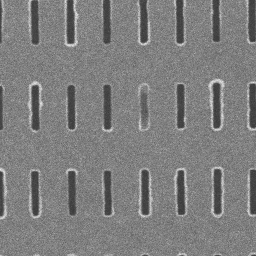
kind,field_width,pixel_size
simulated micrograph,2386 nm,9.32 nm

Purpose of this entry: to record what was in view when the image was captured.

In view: a regular array of holes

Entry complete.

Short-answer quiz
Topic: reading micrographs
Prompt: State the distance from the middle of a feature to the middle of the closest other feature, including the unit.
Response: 335 nm